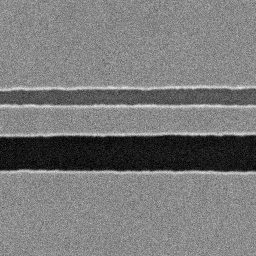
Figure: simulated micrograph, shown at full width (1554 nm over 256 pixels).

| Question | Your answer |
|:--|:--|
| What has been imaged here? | lines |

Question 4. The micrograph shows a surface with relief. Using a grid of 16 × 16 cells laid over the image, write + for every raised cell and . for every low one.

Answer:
++++++++++++++++
++++++++++++++++
++++++++++++++++
++++++++++++++++
++++++++++++++++
++++++++++++++++
++++++++++++++++
++++++++++++++++
++..............
................
................
++++++++++++++++
++++++++++++++++
++++++++++++++++
++++++++++++++++
++++++++++++++++